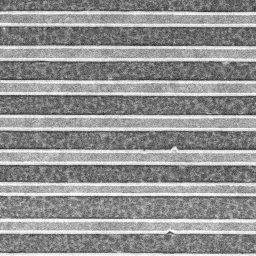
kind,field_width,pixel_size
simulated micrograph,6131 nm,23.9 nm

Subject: parallel lines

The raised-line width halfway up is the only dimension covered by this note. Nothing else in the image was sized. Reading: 302 nanometers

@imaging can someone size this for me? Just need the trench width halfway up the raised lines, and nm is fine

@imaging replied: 527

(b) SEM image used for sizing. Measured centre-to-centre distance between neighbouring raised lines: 0.827 um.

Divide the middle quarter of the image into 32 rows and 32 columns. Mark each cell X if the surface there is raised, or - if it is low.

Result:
--------------------------------
--------------------------------
--------------------------------
--------------------------------
--------------------------------
XXXXXXXXXXXXXXXXXXXXXXXXXXXXXXXX
XXXXXXXXXXXXXXXXXXXXXXXXXXXXXXXX
------------------------XXXXXXXX
--------------------------------
--------------------------------
--------------------------------
--------------------------------
--------------------------------
XXXXXXXXXXXXXXXXXXXXXXXXXXXXXXXX
XXXXXXXXXXXXXXXXXXXXXXXXXXXXXXXX
XXXXXXXXXXXXXXXXXXXXXXXXXXXXXXXX
--------------------------------
--------------------------------
--------------------------------
--------------------------------
--------------------------------
---------------------------X----
XXXXXXXXXXXXXXXXXXXXXXXXXXXXXXXX
XXXXXXXXXXXXXXXXXXXXXXXXXXXXXXXX
XXXXXXXXXXXXXXXXXXXXXXXXXXXXXXXX
--------------------------------
--------------------------------
--------------------------------
--------------------------------
--------------------------------
XXXXXXXXXXXXXXXXXXXXXXXXXXXXXXXX
XXXXXXXXXXXXXXXXXXXXXXXXXXXXXXXX